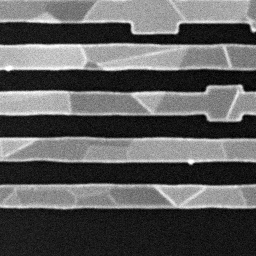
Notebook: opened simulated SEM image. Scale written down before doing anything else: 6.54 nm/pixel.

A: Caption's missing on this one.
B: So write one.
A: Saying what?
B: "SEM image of wiring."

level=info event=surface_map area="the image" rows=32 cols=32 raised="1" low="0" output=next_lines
11111111111111111111111111111111
11111111111111111111111111111111
11111111111111111111111111111111
00000000000000000111110000000001
00000000000000000000000000000000
00000000000000000000000000000000
11111111111111111111111111111111
11111111111111111111111111111111
11111111111111111111111110111111
00000000000000000000000000000000
00000000000000000000000000000000
00001111100000000000000001111110
11111111111111111111111111111111
11111111111111111111111111111111
00000000000000000000000000111100
00000000000000000000000000000000
00000000000000000000000000000000
11111111111111111111111111111111
11111111111111111111111111111111
11111111111111111111111111111111
00000000000000000000000000000000
00000000000000000000000000000000
00000000000000000000000000000000
11111111111111111111111111111111
11111111111111111111111111111111
11111111111111111111111111111111
00000000000000000000000000000000
00000000000000000000000000000000
00000000000000000000000000000000
00000000000000000000000000000000
00000000000000000000000000000000
00000000000000000000000000000000